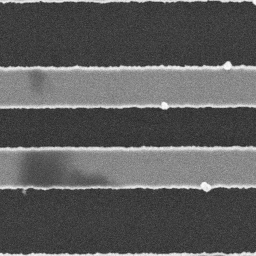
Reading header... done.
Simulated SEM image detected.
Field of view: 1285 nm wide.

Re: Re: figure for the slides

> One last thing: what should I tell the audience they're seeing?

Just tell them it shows lines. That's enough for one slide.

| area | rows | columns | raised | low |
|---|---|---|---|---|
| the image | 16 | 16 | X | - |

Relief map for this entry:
----------------
----------------
----------------
----------------
XXXXXXXXXXXXXXXX
XXXXXXXXXXXXXXXX
XXXXXXXXXXXXXXXX
----------------
----------------
XXXXXXXXXXXXXXXX
XXXXXXXXXXXXXXXX
XXXXXXXXXXXXXXXX
----------------
----------------
----------------
----------------